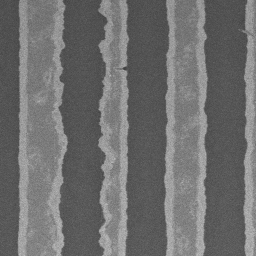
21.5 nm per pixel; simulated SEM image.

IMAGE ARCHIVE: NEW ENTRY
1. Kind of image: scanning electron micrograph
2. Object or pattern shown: one or a few lines or trenches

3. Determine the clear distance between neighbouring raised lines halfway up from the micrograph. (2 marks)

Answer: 0.996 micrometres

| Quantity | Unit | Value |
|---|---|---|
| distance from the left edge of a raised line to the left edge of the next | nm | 1560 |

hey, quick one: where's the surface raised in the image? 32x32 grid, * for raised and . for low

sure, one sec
...*****.....**......****......*
...*****.....***.....****......*
...****.......**.....****......*
...****.......**.....****......*
...****.......**.....****......*
...****......**.......***......*
...****......**......****......*
...****......**......****......*
...****......**......****......*
...****......**......****......*
...****......**......****......*
...****......***.....****......*
...****......***.....****......*
...****......**......****......*
...****......***.....****......*
...****......***.....****......*
...*****.....***.....*****.....*
...*****.....***.....****......*
...*****.....***.....****......*
...*****......**.....****......*
...*****......*......****......*
...****......***.....****......*
...****......***.....****......*
...****......**......****......*
...****......***.....****......*
...****......***.....****......*
...****......***.....****......*
...****.......*......****......*
...****......***.....****......*
...*****.....**......****......*
...*****.....**......****......*
...****......**......****......*